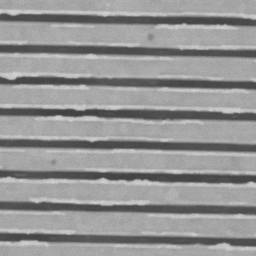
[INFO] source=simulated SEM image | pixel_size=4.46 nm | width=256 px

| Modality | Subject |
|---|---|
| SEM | parallel lines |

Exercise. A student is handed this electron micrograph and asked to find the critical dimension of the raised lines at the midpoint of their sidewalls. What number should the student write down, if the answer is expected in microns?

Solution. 0.0969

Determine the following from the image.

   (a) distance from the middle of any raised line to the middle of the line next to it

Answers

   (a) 140 nm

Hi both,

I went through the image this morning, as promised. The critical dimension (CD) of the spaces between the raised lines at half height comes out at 41.8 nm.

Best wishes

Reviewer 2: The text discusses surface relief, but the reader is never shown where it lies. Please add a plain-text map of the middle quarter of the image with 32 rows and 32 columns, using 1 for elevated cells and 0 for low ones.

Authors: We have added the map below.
11111111111111111111111111111111
11111111111111111111111111111111
11111111111111111111111111111111
00000000000000000000000000000011
00000000000000000000000000000000
10001000000000000000000000000000
11111111111111111111111111111111
11111111111111111111111111111111
11111111111111111111111111111111
11111111111111111111111111111111
11111111111111111111111111111111
00000000000000000000000000000000
00000000000000000000000000000000
11111111100000000000000000000000
11111111111111111111111111111111
11111111111111111111111111111111
11111111111111111111111111111111
11111111111111111111111111111111
11111111111111111111111111111111
00000000000000000000000000000000
00000000000000000000000000000000
00000000000011111100000000000000
11111111111111111111111111111111
11111111111111111111111111111111
11111111111111111111111111111111
11111111111111111111111111111111
11100111111111111111111111111111
00000000000000000000000000000000
00000000000000000000000000000000
11111111111111111111110000000000
11111111111111111111111111111111
11111111111111111111111111111111